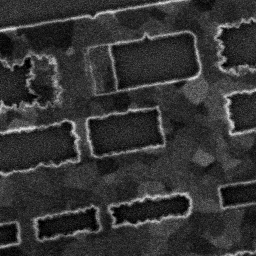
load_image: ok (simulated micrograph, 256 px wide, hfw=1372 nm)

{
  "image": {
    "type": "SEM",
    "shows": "one or a few lines or trenches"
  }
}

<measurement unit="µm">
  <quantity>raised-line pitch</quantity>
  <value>0.404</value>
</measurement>